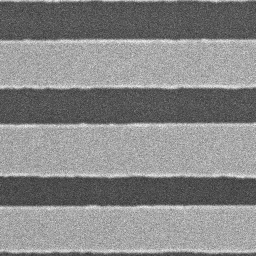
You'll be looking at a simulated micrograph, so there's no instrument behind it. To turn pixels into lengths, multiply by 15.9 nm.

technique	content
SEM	lines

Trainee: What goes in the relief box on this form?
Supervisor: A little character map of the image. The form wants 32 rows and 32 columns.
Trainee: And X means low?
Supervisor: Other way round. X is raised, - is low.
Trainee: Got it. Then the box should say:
--------------------------------
--------------------------------
--------------------------------
--------------------------------
--------------------------------
XXXXXXXXXXXXXXXXXXXXXXXXXXXXXXXX
XXXXXXXXXXXXXXXXXXXXXXXXXXXXXXXX
XXXXXXXXXXXXXXXXXXXXXXXXXXXXXXXX
XXXXXXXXXXXXXXXXXXXXXXXXXXXXXXXX
XXXXXXXXXXXXXXXXXXXXXXXXXXXXXXXX
XXXXXXXXXXXXXXXXXXXXXXXXXXXXXXXX
--------------------------------
--------------------------------
--------------------------------
--------------------------------
-------------------------------X
XXXXXXXXXXXXXXXXXXXXXXXXXXXXXXXX
XXXXXXXXXXXXXXXXXXXXXXXXXXXXXXXX
XXXXXXXXXXXXXXXXXXXXXXXXXXXXXXXX
XXXXXXXXXXXXXXXXXXXXXXXXXXXXXXXX
XXXXXXXXXXXXXXXXXXXXXXXXXXXXXXXX
XXXXXXXXXXXXXXXXXXXXXXXXXXXXXXXX
--------------------------------
--------------------------------
--------------------------------
--------------------------------
XXXXXXXXXXXXXXXXXXXXXXXXXXXXXXXX
XXXXXXXXXXXXXXXXXXXXXXXXXXXXXXXX
XXXXXXXXXXXXXXXXXXXXXXXXXXXXXXXX
XXXXXXXXXXXXXXXXXXXXXXXXXXXXXXXX
XXXXXXXXXXXXXXXXXXXXXXXXXXXXXXXX
XXXXXXXXX-XXXXXXXXXXX---XXXXXXXX